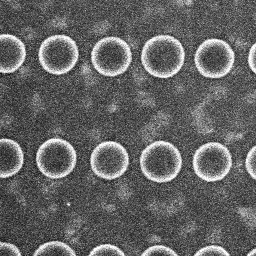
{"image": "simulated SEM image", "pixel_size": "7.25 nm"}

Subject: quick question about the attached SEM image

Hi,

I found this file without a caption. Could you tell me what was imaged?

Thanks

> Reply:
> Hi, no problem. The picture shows a regular array of raised bodies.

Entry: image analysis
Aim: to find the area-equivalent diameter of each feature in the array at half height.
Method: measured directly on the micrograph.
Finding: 270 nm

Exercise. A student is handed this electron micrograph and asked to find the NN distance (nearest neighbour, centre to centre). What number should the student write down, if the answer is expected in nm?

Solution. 373